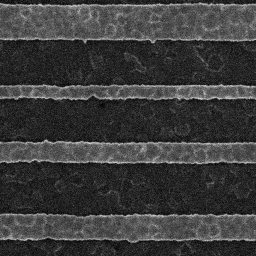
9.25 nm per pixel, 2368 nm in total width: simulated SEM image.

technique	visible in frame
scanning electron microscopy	one or a few lines or trenches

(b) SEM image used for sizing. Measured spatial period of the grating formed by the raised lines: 633 nanometres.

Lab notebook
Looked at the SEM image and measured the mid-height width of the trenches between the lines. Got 0.423 um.